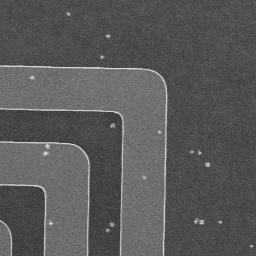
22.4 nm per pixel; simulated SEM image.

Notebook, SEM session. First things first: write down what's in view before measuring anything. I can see groups of lines, slits or small figures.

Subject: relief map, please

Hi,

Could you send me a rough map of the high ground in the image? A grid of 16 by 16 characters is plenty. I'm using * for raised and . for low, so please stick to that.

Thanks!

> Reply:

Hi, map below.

................
................
................
................
**********......
**********......
**********......
........**......
........**......
*****...**......
******..**......
******..**......
...***..**......
...***..**......
*..**...**......
*..**...**......